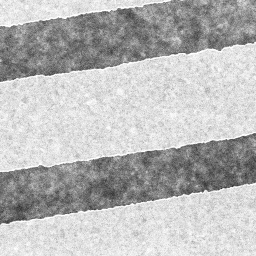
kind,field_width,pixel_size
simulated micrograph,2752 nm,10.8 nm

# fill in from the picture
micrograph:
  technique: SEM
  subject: one or a few lines or trenches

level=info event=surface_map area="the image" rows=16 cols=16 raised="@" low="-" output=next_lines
@@@@@@@@--------
@---------------
----------------
-----------@@@@@
-----@@@@@@@@@@@
@@@@@@@@@@@@@@@@
@@@@@@@@@@@@@@@@
@@@@@@@@@@@@@@@@
@@@@@@@@@@@@@@@-
@@@@@@@@@-------
@@--------------
----------------
----------@@@@@@
----@@@@@@@@@@@@
@@@@@@@@@@@@@@@@
@@@@@@@@@@@@@@@@